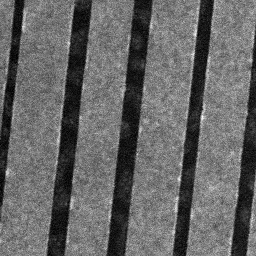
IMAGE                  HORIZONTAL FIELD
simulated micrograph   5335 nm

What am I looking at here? one or a few lines or trenches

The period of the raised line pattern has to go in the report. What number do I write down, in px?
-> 61.8